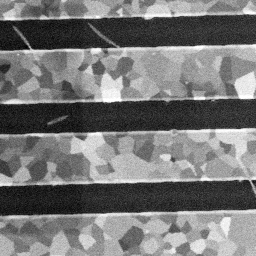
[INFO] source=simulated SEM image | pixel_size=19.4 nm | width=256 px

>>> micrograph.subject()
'lines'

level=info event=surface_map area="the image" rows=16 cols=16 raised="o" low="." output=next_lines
oooooooooooooooo
................
................
oooooooooooooooo
oooooooooooooooo
oooooooooooooooo
................
................
oooooooooooooooo
oooooooooooooooo
oooooooooooooooo
oooo............
................
..oooooooooooooo
oooooooooooooooo
oooooooooooooooo